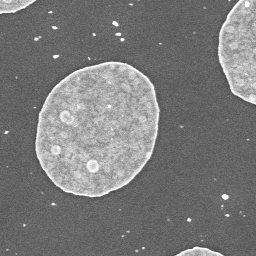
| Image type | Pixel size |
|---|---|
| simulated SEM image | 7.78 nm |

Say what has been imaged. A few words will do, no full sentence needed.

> raised bodies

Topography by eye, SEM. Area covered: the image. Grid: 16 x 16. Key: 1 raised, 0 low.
1000000000000001
0000000000000011
0000000000000011
0000000000000011
0000011110000011
0001111111000011
0001111111000000
0011111111000000
0011111111000000
0011111110000000
0001111110000000
0000111100000000
0000000000000000
0000000000000000
0000000000000000
0000000000000000